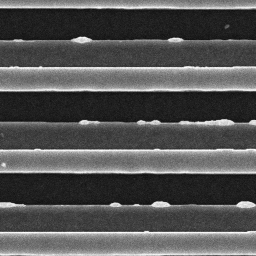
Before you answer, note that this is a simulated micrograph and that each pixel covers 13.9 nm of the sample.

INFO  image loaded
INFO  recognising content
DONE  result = lines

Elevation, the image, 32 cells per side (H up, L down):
HHHHHHHHHHHHHHHHHHHHHHHHHHHHHHHH
LLLLLLLLLLLLLLLLLLLLLLLLLLLLLLLL
LLLLLLLLLLLLLLLLLLLLLLLLLLLLLLLL
LLLLLLLLLLLLLLLLLLLLLLLLLLLLLLLL
LLLLLLLLLLLLLLLLLLLLLLLLLLLLLLLL
HHHHHHHHHHHHHHHHHHHHHHHHHHHHHHHH
HHHHHHHHHHHHHHHHHHHHHHHHHHHHHHHH
HHHHHHHHHHHHHHHHHHHHHHHHHHHHHHHH
HHHHHHHHHHHHHHHHHHHHHHHHHHHHHHHH
HHHHHHHHHHHHHHHHHHHHHHHHHHHHHHHH
HHHHHHHHHHHHHHHHHHHHHHHHHHHHHHHH
LLLLLLLLLLLLLLLLLLLLLLLLLLLLLLLL
LLLLLLLLLLLLLLLLLLLLLLLLLLLLLLLL
LLLLLLLLLLLLLLLLLLLLLLLLLLLLLLLL
LLLLLLLLLLLLLLLLLLLLLLLLLLLLLLLL
HHHHHHHHHHHHHHHHHHHHHHHHHHHHHHHH
HHHHHHHHHHHHHHHHHHHHHHHHHHHHHHHH
HHHHHHHHHHHHHHHHHHHHHHHHHHHHHHHH
HHHHHHHHHHHHHHHHHHHHHHHHHHHHHHHH
HHHHHHHHHHHHHHHHHHHHHHHHHHHHHHHH
HHHHHHHHHHHHHHHHHHHHHHHHHHHHHHHH
LLLHLLLHHHHHHHHHHHHHHHHHHHHHHHHH
LLLLLLLLLLLLLLLLLLLLLLLLLLLLLLLL
LLLLLLLLLLLLLLLLLLLLLLLLLLLLLLLL
LLLLLLLLLLLLLLLLLLLLLLLLLLLLLLLL
HHLLLLLLLLLLLLHLLLLHHLLLLLLLLLHH
HHHHHHHHHHHHHHHHHHHHHHHHHHHHHHHH
HHHHHHHHHHHHHHHHHHHHHHHHHHHHHHHH
HHHHHHHHHHHHHHHHHHHHHHHHHHHHHHHH
HHHHHHHHHHHHHHHHHHHHHHHHHHHHHHHH
HHHHHHHHHHHHHHHHHHHHHHHHHHHHHHHH
HHHHHHHHHHHHHHHHHHHHHHHHHHHHHHHH